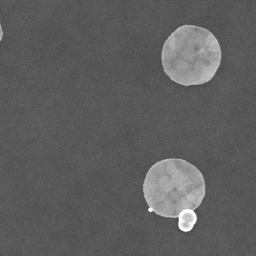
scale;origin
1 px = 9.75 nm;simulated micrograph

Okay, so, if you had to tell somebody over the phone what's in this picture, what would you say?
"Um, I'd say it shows raised bodies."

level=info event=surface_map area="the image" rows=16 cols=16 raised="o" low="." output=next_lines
................
................
..........oooo..
..........oooo..
..........ooo...
................
................
................
................
................
.........ooo....
.........oooo...
.........oooo...
..........oo....
................
................